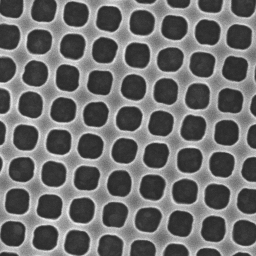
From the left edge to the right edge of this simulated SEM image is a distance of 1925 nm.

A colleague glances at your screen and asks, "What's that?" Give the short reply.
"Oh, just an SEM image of a regular array of holes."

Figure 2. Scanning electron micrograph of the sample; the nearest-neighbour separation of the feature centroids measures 242 nm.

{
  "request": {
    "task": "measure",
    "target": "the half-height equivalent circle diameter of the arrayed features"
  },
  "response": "200 nm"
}